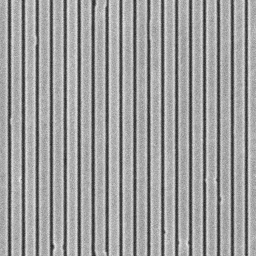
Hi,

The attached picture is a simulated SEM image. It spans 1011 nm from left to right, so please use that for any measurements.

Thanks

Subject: parallel lines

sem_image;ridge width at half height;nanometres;38.5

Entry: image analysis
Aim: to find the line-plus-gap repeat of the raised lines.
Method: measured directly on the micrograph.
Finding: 55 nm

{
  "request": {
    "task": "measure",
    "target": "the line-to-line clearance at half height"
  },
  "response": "15.3 nm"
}